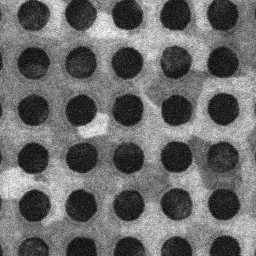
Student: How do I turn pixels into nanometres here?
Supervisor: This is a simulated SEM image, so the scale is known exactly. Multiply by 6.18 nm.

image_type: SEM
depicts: a regular array of holes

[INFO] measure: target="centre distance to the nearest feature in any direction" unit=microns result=0.288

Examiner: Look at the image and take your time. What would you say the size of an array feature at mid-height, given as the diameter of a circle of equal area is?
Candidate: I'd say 0.205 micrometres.